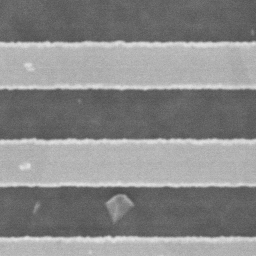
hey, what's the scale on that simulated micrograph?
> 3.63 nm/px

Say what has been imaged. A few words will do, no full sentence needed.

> lines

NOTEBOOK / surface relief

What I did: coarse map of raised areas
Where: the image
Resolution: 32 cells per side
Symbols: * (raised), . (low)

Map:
................................
................................
................................
................................
................................
********************************
********************************
********************************
********************************
********************************
********************************
................................
................................
................................
................................
................................
................................
..***...*....*.*...****...*...*.
********************************
********************************
********************************
********************************
********************************
................................
................................
................................
................................
................................
................................
................................
********************************
********************************